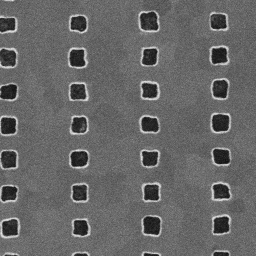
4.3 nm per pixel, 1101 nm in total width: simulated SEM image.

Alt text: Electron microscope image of a regular array of holes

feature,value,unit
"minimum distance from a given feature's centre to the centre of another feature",0.145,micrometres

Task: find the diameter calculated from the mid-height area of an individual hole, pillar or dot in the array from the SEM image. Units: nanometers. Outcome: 78.7